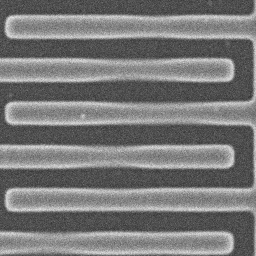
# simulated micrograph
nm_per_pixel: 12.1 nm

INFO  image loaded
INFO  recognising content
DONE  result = groups of lines, slits or small figures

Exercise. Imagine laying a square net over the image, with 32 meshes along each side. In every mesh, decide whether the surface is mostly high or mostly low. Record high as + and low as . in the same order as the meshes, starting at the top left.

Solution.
................................
................................
.+++++++++++++++++++++++++++++++
.+++++++++++++++++++++++++++++++
.+++++++++++++++.....+++++++++++
................................
................................
+++++++++++...........+++++++...
+++++++++++++++++++++++++++++...
+++++++++++++++++++++++++++++...
................................
................................
...............................+
.+++++++++++++++++++++++++++++++
.+++++++++++++++++++++++++++++++
..............................++
................................
................................
+++++++++++.....+++++++++++++...
+++++++++++++++++++++++++++++...
+++++++++++++++++++++++++++++...
................................
................................
...............................+
.+++++++++++++++++++++++++++++++
.+++++++++++++++++++++++++++++++
................................
................................
................................
+++++++.+++++++++++++++++++++...
+++++++++++++++++++++++++++++...
+++......++++++++++++++++++++...